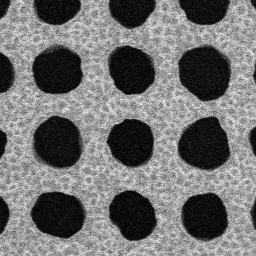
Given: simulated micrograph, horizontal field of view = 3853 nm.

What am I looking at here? a regular array of holes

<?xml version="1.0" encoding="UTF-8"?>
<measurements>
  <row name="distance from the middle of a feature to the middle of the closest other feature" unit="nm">1080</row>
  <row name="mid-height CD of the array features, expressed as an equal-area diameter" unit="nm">753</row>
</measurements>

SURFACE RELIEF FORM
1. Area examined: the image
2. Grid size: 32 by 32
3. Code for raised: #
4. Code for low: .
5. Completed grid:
.###......####.....###.......##.
.###......####.....####.....####
#####....#####....######....####
################.###############
################################
################################
#####....#####....#####....#####
.###......###......###.......###
..##......###......###.......###
..##......####.....###.......###
..###.....####.....####......###
.####....######...######....####
#########################.######
################################
################################
#####....######...######....####
####......####.....####.....###.
.###......###......###......###.
.###......####.....###.......###
#####.....####.....###.......###
######...######...######....####
################################
################################
################################
#####....#####....######...#####
.###......####.....####.....####
.###.......###.....####.....###.
.###.......###......###.....###.
.####.....#####....####.....####
######...######...######...#####
################################
################################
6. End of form